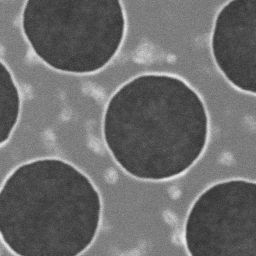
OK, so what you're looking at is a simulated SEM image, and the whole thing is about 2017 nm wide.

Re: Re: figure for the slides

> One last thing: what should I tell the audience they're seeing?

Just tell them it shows holes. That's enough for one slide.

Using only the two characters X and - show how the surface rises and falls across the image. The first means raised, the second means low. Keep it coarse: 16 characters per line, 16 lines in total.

XX------XXXXXX--
X-------XXXXX---
XX------XXXXX---
XX-----XXXXXX---
-XXXX-XXXXXXXX--
-XXXXXXX----XXX-
-XXXXXX------XXX
-XXXXXX------XXX
-XXXXXX------XXX
XXXXXXX------XXX
X----XXX----XXXX
------XXXXXXXX--
------XXXXXX----
------XXXXXX----
------XXXXXX----
X----XXXXXXX----